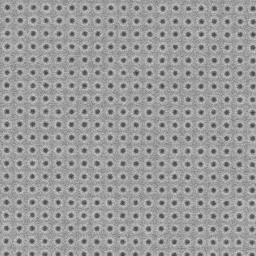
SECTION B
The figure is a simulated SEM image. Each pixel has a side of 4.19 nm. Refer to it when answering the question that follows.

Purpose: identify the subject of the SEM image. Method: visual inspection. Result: a regular array of holes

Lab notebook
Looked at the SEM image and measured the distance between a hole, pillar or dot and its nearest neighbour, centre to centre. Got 0.0533 um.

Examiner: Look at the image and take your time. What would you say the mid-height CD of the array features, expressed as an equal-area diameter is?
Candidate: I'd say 23.6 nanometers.